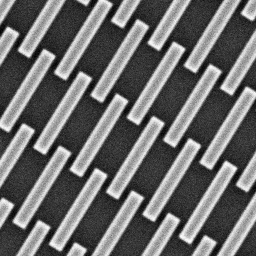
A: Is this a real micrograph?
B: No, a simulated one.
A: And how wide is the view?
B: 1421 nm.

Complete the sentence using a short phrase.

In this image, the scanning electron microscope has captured groups of lines, slits or small figures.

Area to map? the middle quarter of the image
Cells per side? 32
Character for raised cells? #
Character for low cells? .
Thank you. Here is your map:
###........####.........####..##
##.........####........####.....
#...#.....####.........###......
#..###...####.........####......
..####...####........####.......
..####..####.........####.......
.####...###.........####........
.####..####........####.........
####....##..###....####........#
###.........####..####.........#
###........####...###.........##
##.........####..####.........##
#.........####..####.........###
#........####...####..#.....####
.........####.....#..####...####
........####.........####..####.
........####........####..####..
.......####.........###...####..
......####.........####..####...
......####........####....##...#
.....####.........####.....#..##
.....###.........####.........##
#...####........####.........###
#..####.........####........####
...####........####.........####
..####.........####........####.
..###...#.....####.........###..
...##..###...####.........####..
......####...####........####...
......####..####.........###....
.....####...###.........####....
.....####..####........####.....